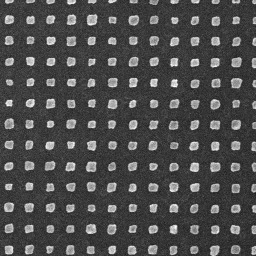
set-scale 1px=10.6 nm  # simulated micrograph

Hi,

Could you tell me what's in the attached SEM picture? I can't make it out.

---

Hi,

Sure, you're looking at a regular array of raised bodies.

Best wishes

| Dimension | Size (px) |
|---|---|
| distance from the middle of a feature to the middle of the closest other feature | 20.2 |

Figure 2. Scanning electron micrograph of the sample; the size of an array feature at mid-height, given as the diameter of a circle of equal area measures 8.45 pixels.